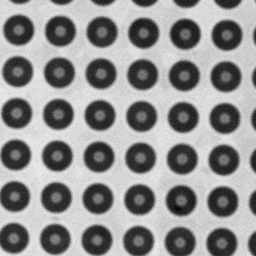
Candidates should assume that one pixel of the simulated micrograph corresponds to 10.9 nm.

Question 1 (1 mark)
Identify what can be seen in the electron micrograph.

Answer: an array of small figures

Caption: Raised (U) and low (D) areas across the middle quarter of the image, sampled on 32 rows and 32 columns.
DDDUUDDDDDDDDUUUDDDDDDDUUUUDDDDD
DDDUUDDDDDDDDUUUDDDDDDDDUUDDDDDD
DDDUUDDDDUDDDDUUDDDUDDDDUUDDDDDD
DDDUUDDDDDDDDUUDDDDDDDDDUUDDDDDD
DDUUUUDDDDDDDUUUDDDDDDDUUUDDDDDD
DUUUUUDDDDDDUUUUUDDDDDDUUUUDDDDD
UUUUUUUUDDDUUUUUUUDDDDUUUUUUDDDD
UUUUUUUUUUUUUUUUUUUUUUUUUUUUUUUU
UUUUUUUUUUUUUUUUUUUUUUUUUUUUUUUU
DUUUUUDDDDDDUUUUUDDDDDUUUUUUDDDD
DDUUUDDDDDDDUUUUDDDDDDDUUUUDDDDD
DDDUUDDDDDDDDUUUDDDDDDDUUUDDDDDD
DDDUUDDDDDDDDUUDDDDDDDDDUUDDDDDD
DDDUUDDDDDDDDUUDDDDUDDDDUUDDDUDD
DDUUUDDDDDDDDUUDDDDDDDDUUUDDDDDD
DDUUUUDDDDDDUUUUDDDDDDDUUUDDDDDD
UUUUUUUDDDDUUUUUUDDDDDUUUUUDDDDD
UUUUUUUUUUUUUUUUUUUUUUUUUUUUUDDU
UUUUUUUUUUUUUUUUUUUUUUUUUUUUUUUU
DUUUUUUDDDDUUUUUUUDDDUUUUUUUUDUU
DDUUUUDDDDDDUUUUDDDDDDUUUUUDDDDD
DDUUUDDDDDDDDUUDDDDDDDDUUUDDDDDD
DDDUDDDDDDDDDUUDDDDDDDDUUUDDDDDD
DDDUDDDDUDDDDUUDDDDUDDDUUDDDDUDD
DDUUUDDDDDDDDUUDDDDDDDDUUDDDDDDD
DDUUUDDDDDDDUUUDDDDDDDDUUUDDDDDD
DUUUUUDDDDDUUUUUDDDDDDUUUUDDDDDD
UUUUUUUUDUUUUUUUUUDDUUUUUUUDDDDD
UUUUUUUUUUUUUUUUUUUUUUUUUUUUUUUU
UUUUUUUUDUUUUUUUUUUUUUUUUUUUUUUU
DUUUUUDDDDDUUUUUUDDDDUUUUUUDDDDU
DDUUUDDDDDDDUUUDDDDDDDUUUUDDDDDD